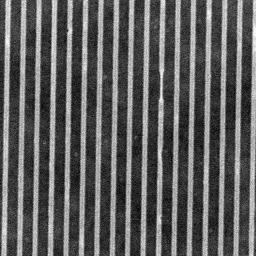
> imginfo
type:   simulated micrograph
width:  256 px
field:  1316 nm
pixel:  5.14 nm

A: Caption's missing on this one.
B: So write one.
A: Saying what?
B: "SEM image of parallel lines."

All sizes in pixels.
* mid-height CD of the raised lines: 4.12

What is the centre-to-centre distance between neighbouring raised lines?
79.5 nm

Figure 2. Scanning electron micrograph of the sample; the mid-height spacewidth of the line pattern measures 59.2 nm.